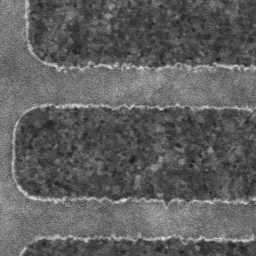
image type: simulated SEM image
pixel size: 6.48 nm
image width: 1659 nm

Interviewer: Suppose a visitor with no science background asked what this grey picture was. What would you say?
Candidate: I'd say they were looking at one or a few lines or trenches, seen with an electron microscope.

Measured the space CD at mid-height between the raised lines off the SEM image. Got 249 nanometres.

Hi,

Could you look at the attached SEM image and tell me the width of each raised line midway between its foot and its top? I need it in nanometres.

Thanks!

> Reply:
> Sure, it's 613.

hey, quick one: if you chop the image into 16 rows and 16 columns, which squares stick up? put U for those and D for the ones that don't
DDUUUUUUUUUUUUUU
DDUUUUUUUUUUUUUU
DDUUUUUUUUUUUUUU
DDUUUUUUUUUUUUUU
DDDDDDDDDDDDDDDD
DDDDDDDDDDDDDDDD
DDDDDDDDDDDDDDDD
DUUUUUUUUUUUUUUU
DUUUUUUUUUUUUUUU
DUUUUUUUUUUUUUUU
DUUUUUUUUUUUUUUU
DUUUUUUUUUUUUUUU
DDDUUDDUUUUUUUUU
DDDDDDDDDDDDDDDD
DDDDDDDDDDDDDDDD
DDUUUUUUUUUUUUUU